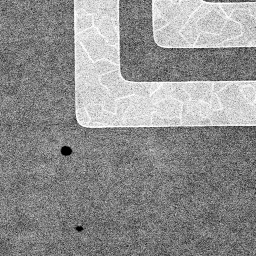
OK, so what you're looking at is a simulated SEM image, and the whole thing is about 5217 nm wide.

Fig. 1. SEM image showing groups of lines, slits or small figures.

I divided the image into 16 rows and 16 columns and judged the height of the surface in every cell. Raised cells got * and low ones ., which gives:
.....**...******
.....**...******
.....**...******
.....**.........
.....***........
.....***********
.....***********
.....***********
................
................
................
................
................
................
................
................